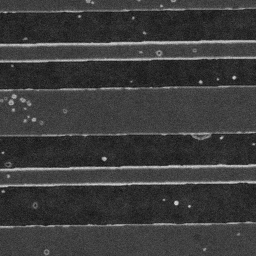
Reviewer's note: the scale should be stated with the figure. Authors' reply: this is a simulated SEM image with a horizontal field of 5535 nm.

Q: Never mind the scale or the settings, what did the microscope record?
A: lines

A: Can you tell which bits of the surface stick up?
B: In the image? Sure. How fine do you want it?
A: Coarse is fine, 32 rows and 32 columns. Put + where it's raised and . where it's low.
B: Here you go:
++++++++++++++++++++++++++++++++
++..............................
................................
................................
................................
...........+.+++++++++++++++++++
++++++++++++++++++++++++++++++++
+++++++++.......................
................................
................................
................................
++++++++++++++++++++++++++++++++
++++++++++++++++++++++++++++++++
++++++++++++++++++++++++++++++++
++++++++++++++++++++++++++++++++
++++++++++++++++++++++++++++++++
++++++++++++++++++++++++++++++++
................................
................................
................................
................................
++++++++++++++++++++++++++++++++
++++++++++++++++++++++++++++++++
................................
................................
................................
................................
................................
++++++++++++++++++++++++++++++++
++++++++++++++++++++++++++++++++
++++++++++++++++++++++++++++++++
++++++++++++++++++++++++++++++++